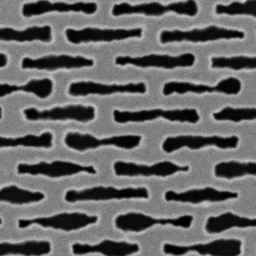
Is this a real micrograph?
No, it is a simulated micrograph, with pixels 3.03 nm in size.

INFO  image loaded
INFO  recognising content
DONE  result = a regular array of holes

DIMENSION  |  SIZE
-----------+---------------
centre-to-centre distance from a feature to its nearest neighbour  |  49.4 pixels